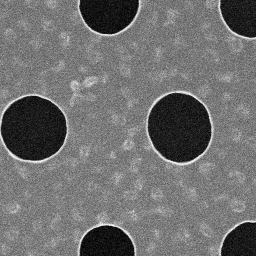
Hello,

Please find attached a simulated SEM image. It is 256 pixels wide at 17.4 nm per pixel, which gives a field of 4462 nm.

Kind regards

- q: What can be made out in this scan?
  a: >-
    holes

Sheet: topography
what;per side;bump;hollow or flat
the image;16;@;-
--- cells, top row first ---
@@@@@----@@@@@--
@@@@@---@@@@@@--
@@@@@@@@@@@@@@@@
@@@@@@@@@@@@@@@@
@@@@@@@@@@@@@@@@
@@@@@@@@@@@@@@@@
@--@@@@@@@---@@@
----@@@@@----@@@
----@@@@@----@@@
@---@@@@@@---@@@
@@@@@@@@@@@@@@@@
@@@@@@@@@@@@@@@@
@@@@@@@@@@@@@@@@
@@@@@@@@@@@@@@@@
@@@@@@--@@@@@@--
@@@@@---@@@@@@--